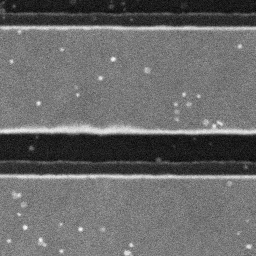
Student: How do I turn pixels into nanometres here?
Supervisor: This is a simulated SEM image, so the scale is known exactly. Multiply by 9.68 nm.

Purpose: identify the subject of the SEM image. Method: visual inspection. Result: lines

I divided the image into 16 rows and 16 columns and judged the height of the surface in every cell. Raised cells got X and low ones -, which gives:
----------------
----------------
XXXXXXXXXXXXXXXX
XXXXXXXXXXXXXXXX
XXXXXXXXXXXXXXXX
XXXXXXXXXXXXXXXX
XXXXXXXXXXXXXXXX
XXXXXXXXXXXXXXXX
----------------
----------------
----------------
XXXXXXXXXXXXXXXX
XXXXXXXXXXXXXXXX
XXXXXXXXXXXXXXXX
XXXXXXXXXXXXXXXX
XXXXXXXXXXXXXXXX